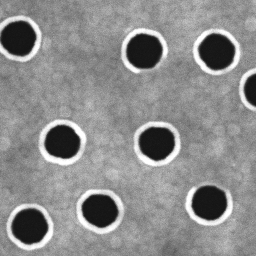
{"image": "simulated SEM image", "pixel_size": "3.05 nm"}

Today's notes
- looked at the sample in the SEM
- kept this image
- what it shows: holes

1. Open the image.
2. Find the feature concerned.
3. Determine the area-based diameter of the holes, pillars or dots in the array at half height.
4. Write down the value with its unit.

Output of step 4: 35.4 pixels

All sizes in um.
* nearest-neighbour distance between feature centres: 0.22